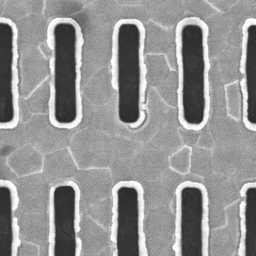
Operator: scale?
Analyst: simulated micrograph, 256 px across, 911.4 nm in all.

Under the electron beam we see holes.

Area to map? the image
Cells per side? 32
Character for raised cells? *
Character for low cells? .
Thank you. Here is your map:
********************************
********************************
********************************
.******..******..******..******.
..*****..******..******..******.
..*****..******..******..******.
..*****..******..******..******.
..*****...*****..******..******.
..*****...*****..******..******.
..*****...*****..******..******.
.******...*****..******..******.
.******...*****..******..******.
..*****...*****..******...*****.
..*****...*****..******...*****.
..*****..******..******..******.
********************************
********************************
********************************
********************************
********************************
********************************
********************************
********************************
.******..******.*******..******.
.******..******..******..******.
.******..******..******..******.
.******..******..******..******.
.******..******..******..******.
..*****..******..******..******.
..*****..******..******..******.
..*****..******..******..******.
..*****..******..******..******.